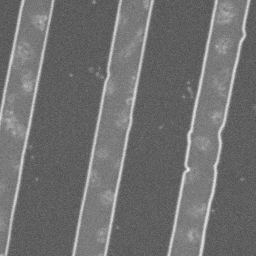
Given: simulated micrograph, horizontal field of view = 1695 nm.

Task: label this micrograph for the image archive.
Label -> one or a few lines or trenches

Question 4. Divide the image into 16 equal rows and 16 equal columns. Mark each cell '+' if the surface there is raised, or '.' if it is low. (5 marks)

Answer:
+..++++..++++..+
+..++++..++++..+
+..++++..++++..+
+..++++..++++..+
+.+++++..++++..+
..+++++..+++..++
..++++..++++..++
..++++..++++..++
..++++..++++..++
.+++++..++++..++
.+++++..++++.+++
.++++..++++..+++
.++++..++++..+++
.++++..++++..+++
.++++..++++..+++
+++++..++++..+++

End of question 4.